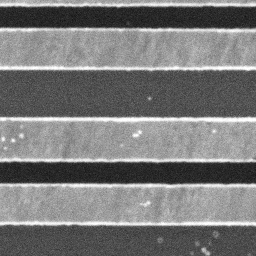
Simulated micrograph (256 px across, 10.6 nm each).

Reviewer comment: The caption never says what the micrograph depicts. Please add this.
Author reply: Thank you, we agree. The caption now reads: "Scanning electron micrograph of lines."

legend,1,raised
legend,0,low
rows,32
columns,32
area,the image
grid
11111111111111111111111111111111
00000000000000000000000000000000
00000000000000000000000000000000
00000000000000000000000000000000
11111111111111111111111111111111
11111111111111111111111111111111
11111111111111111111111111111111
11111111111111111111111111111111
11111111111111111111111111111111
00000000000000000000000000000000
00000000000000000000000000000000
00000000000000000000000000000000
00000000000000000000000000000000
00000000000000000000000000000000
00000000000000000000000000000000
11111111111111111111111111111111
11111111111111111111111111111111
11111111111111111111111111111111
11111111111111111111111111111111
11111111111111111111111111111111
00000000000000000000000000000000
00000000000000000000000000000000
00000000000000000000000000000000
11111111111111111111111111111111
11111111111111111111111111111111
11111111111111111111111111111111
11111111111111111111111111111111
11111111111111111111111111111111
00000000000000000000000000000000
00000000000000000000000000000000
00000000000000000000000000000000
00000000000000000000000000000000